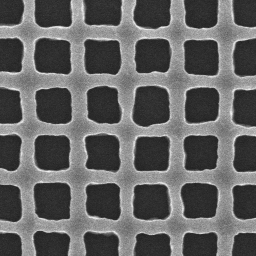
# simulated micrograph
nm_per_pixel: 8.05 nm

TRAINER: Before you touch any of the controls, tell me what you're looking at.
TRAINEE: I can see a regular array of holes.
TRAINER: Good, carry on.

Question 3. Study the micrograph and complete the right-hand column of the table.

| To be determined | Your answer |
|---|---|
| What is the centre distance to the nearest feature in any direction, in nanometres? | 383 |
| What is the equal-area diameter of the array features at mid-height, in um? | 0.312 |